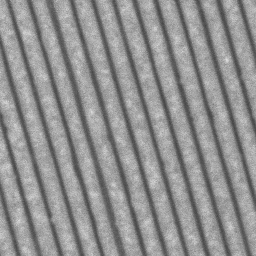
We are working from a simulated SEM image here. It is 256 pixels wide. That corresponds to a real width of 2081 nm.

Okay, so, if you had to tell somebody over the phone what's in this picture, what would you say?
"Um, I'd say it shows parallel lines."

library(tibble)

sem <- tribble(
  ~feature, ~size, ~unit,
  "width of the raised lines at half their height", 117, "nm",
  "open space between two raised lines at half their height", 44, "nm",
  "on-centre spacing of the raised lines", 164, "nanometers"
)